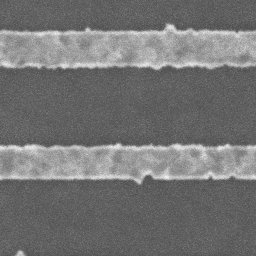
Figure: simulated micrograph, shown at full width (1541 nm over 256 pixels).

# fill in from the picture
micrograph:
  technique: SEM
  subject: one or a few lines or trenches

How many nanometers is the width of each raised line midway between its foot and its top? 192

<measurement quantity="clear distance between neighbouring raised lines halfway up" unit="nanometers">491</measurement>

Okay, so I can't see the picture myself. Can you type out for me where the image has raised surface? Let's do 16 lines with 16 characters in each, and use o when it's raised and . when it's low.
................
................
oooooooooooooooo
oooooooooooooooo
................
................
................
................
................
oooooooooooooooo
oooooooooooooooo
................
................
................
................
................